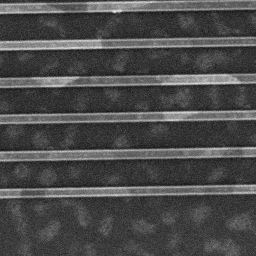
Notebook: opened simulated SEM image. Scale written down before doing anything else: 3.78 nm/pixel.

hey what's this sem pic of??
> parallel lines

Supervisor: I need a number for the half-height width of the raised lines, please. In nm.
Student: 33.5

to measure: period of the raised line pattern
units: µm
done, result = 0.14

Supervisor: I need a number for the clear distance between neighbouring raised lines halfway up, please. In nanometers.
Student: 108